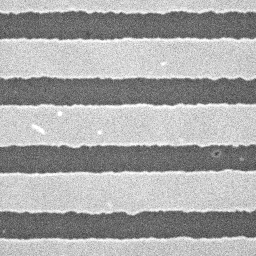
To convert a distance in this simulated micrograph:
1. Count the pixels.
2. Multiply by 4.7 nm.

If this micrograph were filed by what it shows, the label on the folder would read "lines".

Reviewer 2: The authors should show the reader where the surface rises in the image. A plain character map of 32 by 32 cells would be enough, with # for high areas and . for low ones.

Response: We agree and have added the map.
################################
###..#.....#..#######......#....
................................
................................
................................
################################
################################
################################
################################
#####.##########################
................................
................................
................................
################################
################################
################################
################################
################################
................................
................................
................................
.............#.##..#.##.########
################################
################################
################################
################################
..######..########..............
................................
................................
................................
################################
################################